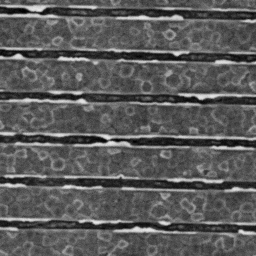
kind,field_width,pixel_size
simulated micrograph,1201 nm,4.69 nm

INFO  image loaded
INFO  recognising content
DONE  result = parallel lines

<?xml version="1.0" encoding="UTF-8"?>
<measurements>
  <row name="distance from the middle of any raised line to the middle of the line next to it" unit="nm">199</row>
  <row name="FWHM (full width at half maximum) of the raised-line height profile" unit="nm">162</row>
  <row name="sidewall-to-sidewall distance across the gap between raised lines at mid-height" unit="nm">36.3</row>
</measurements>